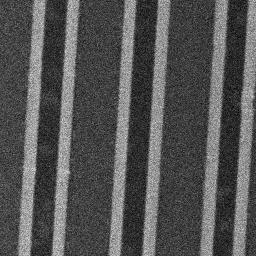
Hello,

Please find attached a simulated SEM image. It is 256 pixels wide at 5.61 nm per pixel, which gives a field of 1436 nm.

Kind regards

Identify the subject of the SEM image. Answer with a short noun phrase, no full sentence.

one or a few lines or trenches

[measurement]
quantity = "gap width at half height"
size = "56 px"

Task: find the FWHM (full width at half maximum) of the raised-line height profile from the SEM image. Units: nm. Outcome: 196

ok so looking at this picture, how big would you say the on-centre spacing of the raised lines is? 508 nm